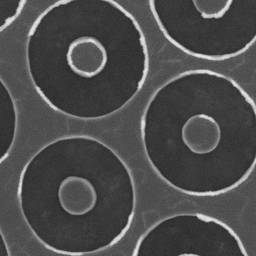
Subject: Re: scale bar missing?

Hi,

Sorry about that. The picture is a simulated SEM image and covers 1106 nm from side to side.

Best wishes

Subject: ring-shaped grooves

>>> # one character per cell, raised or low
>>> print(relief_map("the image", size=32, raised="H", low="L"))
LLHHHHHHLLLLLLHHHHHLLLLLHHHHHLLL
LLHHHHLLLLLLLLLHHHHHLLLLLHHHLLLL
LHHHHLLLLLLLLLLLHHHHLLLLLLLLLLLL
HHHHHLLLLLLLLLLLLHHHLLLLLLLLLLLL
HHHHLLLLLLLLLLLLLHHHHLLLLLLLLLLL
HHHHLLLLLHHHHLLLLLHHHHLLLLLLLLLH
HHHLLLLLHHHHHLLLLLHHHHHHLLLLLLHH
HHHHLLLLHHHHHLLLLLHHHHHHHHHHHHHH
HHHHLLLLLHHHHLLLLLHHHHHHHHHHHHHH
HHHHLLLLLLLLLLLLLLHHHHHLLLLHHHHH
HHHHHLLLLLLLLLLLLHHHHLLLLLLLLHHH
LHHHHLLLLLLLLLLLLHHHLLLLLLLLLLHH
LHHHHHLLLLLLLLLLHHHLLLLLLLLLLLLH
LLHHHHHLLLLLLLLHHHHLLLLLLLLLLLLL
LLHHHHHHHLLLLHHHHHLLLLLLHHLLLLLL
LLHHHHHHHHHHHHHHHHLLLLLHHHHLLLLL
LLHHHHHHHHHHHHHHHHLLLLLHHHHLLLLL
LLHHHHHHLLLLHHHHHHLLLLLHHHHLLLLL
LHHHHHLLLLLLLHHHHHLLLLLLHHHLLLLL
HHHHLLLLLLLLLLLHHHHLLLLLLLLLLLLL
HHHHLLLLLLLLLLLHHHHLLLLLLLLLLLLL
HHHLLLLLLLLLLLLLHHHHLLLLLLLLLLLH
HHHLLLLLHHLLLLLLHHHHHLLLLLLLLLHH
HHHLLLLLHHHLLLLLLHHHHHLLLLLLHHHH
HHHLLLLHHHHHLLLLLHHHHHHHHHHHHHHH
HHHLLLLLHHHHLLLLLHHHHHHHHHHHHHHH
HHHLLLLLLHHLLLLLHHHHHHHHHHHHHHHH
HHHLLLLLLLLLLLLLHHHHHLLLLHHHHHHH
HHHHLLLLLLLLLLLLHHHLLLLLLLLLHHHH
HHHHHLLLLLLLLLLHHHLLLLLLLLLLLHHH
LHHHHHLLLLLLLLHHHHLLLLLLLLLLLLHH
LHHHHHHHHLLHHHHHHLLLLLLLLLLLLLHH